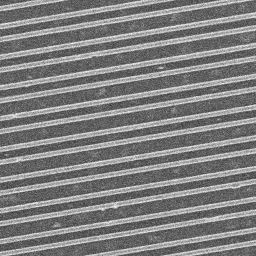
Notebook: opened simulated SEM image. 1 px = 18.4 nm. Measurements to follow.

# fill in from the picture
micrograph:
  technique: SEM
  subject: parallel lines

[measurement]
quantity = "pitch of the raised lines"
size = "0.279 um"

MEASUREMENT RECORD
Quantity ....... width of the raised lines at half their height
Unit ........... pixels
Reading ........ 3.95